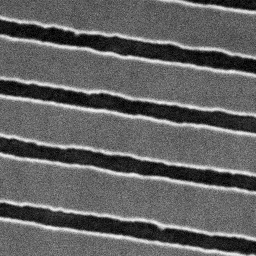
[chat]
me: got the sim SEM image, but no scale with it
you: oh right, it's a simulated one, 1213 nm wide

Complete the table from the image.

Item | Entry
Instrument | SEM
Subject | lines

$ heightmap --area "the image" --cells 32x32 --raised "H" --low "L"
HHHHHHHHHHHHHHHHHHHHHHHHLLLLLLLL
HHHHHHHHHHHHHHHHHHHHHHHHHHHHHHHH
LHHHHHHHHHHHHHHHHHHHHHHHHHHHHHHH
LLLLLLLLHHHHHHHHHHHHHHHHHHHHHHHH
HLLLLLLLLLLLLLLHHHHHHHHHHHHHHHHH
HHHHHHLLLLLLLLLLLLLLLHHHHHHHHHHH
HHHHHHHHHHHHHLLLLLLLLLLLLLLLHHHH
HHHHHHHHHHHHHHHHHHHLLLLLLLLLLLLL
HHHHHHHHHHHHHHHHHHHHHHHHHLLLLLLL
HHHHHHHHHHHHHHHHHHHHHHHHHHHHHHHH
LLLLHHHHHHHHHHHHHHHHHHHHHHHHHHHH
LLLLLLLLLLLHHHHHHHHHHHHHHHHHHHHH
HHHHLLLLLLLLLLLLLHHHHHHHHHHHHHHH
HHHHHHHHHHLLLLLLLLLLLLLLHHHHHHHH
HHHHHHHHHHHHHHHHHHLLLLLLLLLLLLLL
HHHHHHHHHHHHHHHHHHHHHHLLLLLLLLLL
HHHHHHHHHHHHHHHHHHHHHHHHHHHHHLLL
LLLHHHHHHHHHHHHHHHHHHHHHHHHHHHHH
LLLLLLLLLHHHHHHHHHHHHHHHHHHHHHHH
HHLLLLLLLLLLLLLLHHHHHHHHHHHHHHHH
HHHHHHHHLLLLLLLLLLLLLHHHHHHHHHHH
HHHHHHHHHHHHHHLLLLLLLLLLLLLLHHHH
HHHHHHHHHHHHHHHHHHHHHHLLLLLLLLLL
HHHHHHHHHHHHHHHHHHHHHHHHHHHHLLLL
HHHHHHHHHHHHHHHHHHHHHHHHHHHHHHHH
LLHHHHHHHHHHHHHHHHHHHHHHHHHHHHHH
LLLLLLLLHHHHHHHHHHHHHHHHHHHHHHHH
HHLLLLLLLLLLLLLLHHHHHHHHHHHHHHHH
HHHHHHHLLLLLLLLLLLLLLLHHHHHHHHHH
HHHHHHHHHHHHHHLLLLLLLLLLLLLLHHHH
HHHHHHHHHHHHHHHHHHHHHLLLLLLLLLLL
HHHHHHHHHHHHHHHHHHHHHHHHHHHHLLLL